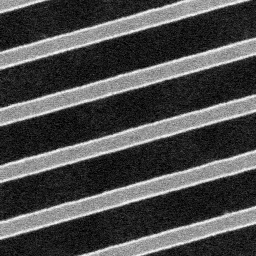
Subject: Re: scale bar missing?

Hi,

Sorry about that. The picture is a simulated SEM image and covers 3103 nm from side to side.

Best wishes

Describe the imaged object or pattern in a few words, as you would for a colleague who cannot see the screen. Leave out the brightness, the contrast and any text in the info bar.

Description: lines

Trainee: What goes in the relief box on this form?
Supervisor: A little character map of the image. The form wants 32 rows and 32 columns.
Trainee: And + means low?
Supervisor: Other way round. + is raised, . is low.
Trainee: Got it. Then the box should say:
++++..................+++++++...
+.................++++++++......
...............+++++++..........
...........+++++++..............
.......++++++++.................
....+++++++..................+++
++++++++..................++++++
++++..................++++++++..
+..................+++++++......
...............+++++++..........
...........++++++++.............
........+++++++.................
....++++++++.................+++
++++++++..................++++++
+++++.................++++++++..
+..................+++++++......
...............+++++++..........
............+++++++.............
........++++++++................
.....+++++++..................++
.++++++++.................++++++
+++++..................+++++++..
+..................++++++++.....
...............++++++++.........
............+++++++.............
........++++++++................
.....+++++++..................++
.++++++++.................++++++
+++++.................++++++++..
+..................+++++++......
...............++++++++.........
............+++++++.............